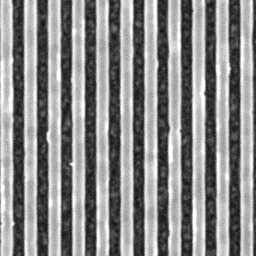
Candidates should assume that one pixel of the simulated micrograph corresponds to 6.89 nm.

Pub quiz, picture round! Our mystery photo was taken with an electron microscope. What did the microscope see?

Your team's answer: parallel lines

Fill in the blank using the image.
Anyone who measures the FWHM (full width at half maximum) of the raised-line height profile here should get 0.075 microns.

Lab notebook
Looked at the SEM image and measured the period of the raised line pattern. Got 24 pixels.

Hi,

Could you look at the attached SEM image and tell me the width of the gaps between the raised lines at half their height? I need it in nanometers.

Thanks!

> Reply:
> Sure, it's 87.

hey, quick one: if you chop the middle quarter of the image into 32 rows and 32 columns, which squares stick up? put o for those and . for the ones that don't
..ooo...ooo...ooo...ooo...ooo...
..ooo...ooo...ooo...ooo...ooo...
..ooo...ooo...ooo...ooo...ooo...
..ooo...ooo...ooo...ooo...ooo...
..ooo...ooo...ooo...ooo...ooo...
..ooo...ooo...ooo...ooo...ooo...
..ooo...ooo...ooo...ooo...ooo...
..ooo...ooo...ooo...ooo...ooo...
..ooo...ooo...ooo...ooo...ooo...
..ooo...ooo...ooo...ooo...ooo...
..ooo...ooo...ooo...ooo...ooo...
..ooo...ooo...ooo...ooo...ooo...
..ooo...ooo...ooo...ooo...ooo...
..ooo...ooo...ooo...ooo...ooo...
..ooo...ooo...ooo...ooo...ooo...
..ooo...ooo...ooo...ooo....oo...
..ooo...ooo...ooo...ooo....oo...
..ooo...ooo...ooo...ooo...ooo...
..ooo...ooo...ooo...ooo...ooo...
..ooo...ooo...ooo...ooo...ooo...
..ooo...ooo...ooo....oo...ooo...
..ooo...ooo...ooo....oo...ooo...
..ooo...ooo...ooo...ooo...ooo...
..ooo...ooo...ooo...ooo...ooo...
..ooo...ooo...ooo...ooo...ooo...
..ooo...ooo...ooo...ooo...ooo...
..ooo...ooo...ooo...ooo...ooo...
..ooo...ooo...ooo....oo...ooo...
..ooo...ooo...ooo....oo...ooo...
..ooo...ooo...ooo...ooo...ooo...
..ooo...ooo...ooo...ooo...ooo...
..ooo...ooo...ooo...ooo...ooo...